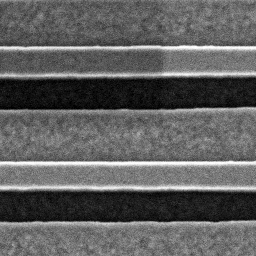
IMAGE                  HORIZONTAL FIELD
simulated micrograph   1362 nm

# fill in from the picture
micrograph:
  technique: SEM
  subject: lines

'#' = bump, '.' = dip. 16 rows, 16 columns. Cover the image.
################
################
################
################
################
................
................
################
################
################
################
################
................
................
################
################